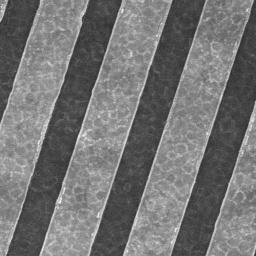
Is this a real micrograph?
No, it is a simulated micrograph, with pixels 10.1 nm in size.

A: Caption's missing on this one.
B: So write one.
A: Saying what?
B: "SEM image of one or a few lines or trenches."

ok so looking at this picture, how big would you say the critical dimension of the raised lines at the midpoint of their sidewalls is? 456 nm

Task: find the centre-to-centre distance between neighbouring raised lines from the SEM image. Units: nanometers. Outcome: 795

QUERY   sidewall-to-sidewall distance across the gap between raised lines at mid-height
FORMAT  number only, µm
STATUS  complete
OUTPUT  0.336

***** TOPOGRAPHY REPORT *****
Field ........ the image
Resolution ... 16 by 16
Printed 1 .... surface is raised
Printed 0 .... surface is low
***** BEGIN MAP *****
0011100011100111
0011100111001110
0011100111001110
0111000111001110
0111001110011100
0111001110011100
1110001110011100
1110011100111000
1110011100111001
1100011100111001
1100111000110001
1100111001110011
1100111001110011
1001110001100011
1001110011100111
0001110011100111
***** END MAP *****